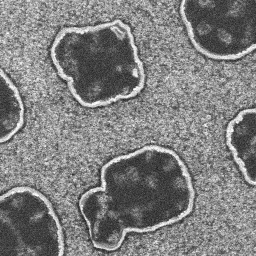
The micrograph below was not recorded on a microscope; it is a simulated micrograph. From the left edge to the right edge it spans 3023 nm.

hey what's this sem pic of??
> raised bodies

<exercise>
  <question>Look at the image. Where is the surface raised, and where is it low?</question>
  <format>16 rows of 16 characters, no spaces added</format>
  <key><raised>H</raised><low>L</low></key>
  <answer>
LLLLLLLLLLLHHHHH
LLLLLLLLLLLLHHHH
LLLLHHHHLLLLHHHH
LLLHHHHHHLLLLHHL
LLLLHHHHHLLLLLLL
HLLLHHHHHLLLLLLL
HLLLLHLLLLLLLLLL
HLLLLLLLLLLLLLLH
HLLLLLLLLLLLLLHH
LLLLLLLLLHHLLLLH
LLLLLLLHHHHLLLLH
LLLLLLHHHHHHLLLL
HHHLLHHHHHHHLLLL
HHHLLHHHHHHLLLLL
HHHHLLHHLLLLLLLL
HHHHLLLLLLLLLLLL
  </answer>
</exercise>